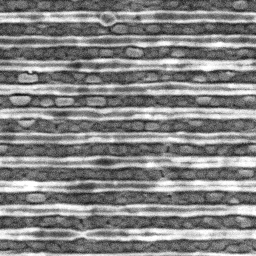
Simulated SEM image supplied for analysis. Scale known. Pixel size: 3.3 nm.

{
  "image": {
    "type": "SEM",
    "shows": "parallel lines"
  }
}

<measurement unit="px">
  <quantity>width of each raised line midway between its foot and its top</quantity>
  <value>8.88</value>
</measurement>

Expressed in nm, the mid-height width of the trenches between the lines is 49.6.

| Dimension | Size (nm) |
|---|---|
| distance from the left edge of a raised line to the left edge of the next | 79.9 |